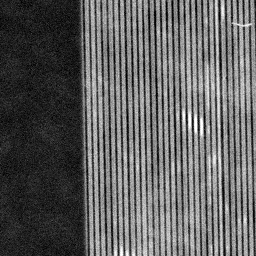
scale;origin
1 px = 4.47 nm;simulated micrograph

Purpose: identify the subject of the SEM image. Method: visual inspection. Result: parallel lines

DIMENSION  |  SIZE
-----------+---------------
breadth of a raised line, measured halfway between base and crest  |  15.1 nm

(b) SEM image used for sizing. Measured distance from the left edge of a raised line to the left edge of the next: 26.5 nanometres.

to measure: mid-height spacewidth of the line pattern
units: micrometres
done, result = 0.0106